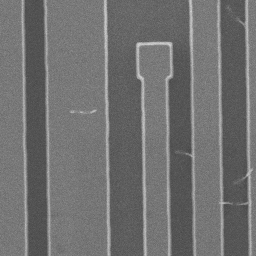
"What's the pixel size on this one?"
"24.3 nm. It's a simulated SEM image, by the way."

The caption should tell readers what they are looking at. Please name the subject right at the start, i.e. groups of lines, slits or small figures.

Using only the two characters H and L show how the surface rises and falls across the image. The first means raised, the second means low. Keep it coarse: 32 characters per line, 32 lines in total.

HHHLLLHHHHHHHLLLLLLLLLLLHHHLLLLH
HHHLLLHHHHHHHLLLLLLLLLLLHHHLLLLH
HHHLLLHHHHHHHLLLLLLLLLLLHHHLLLLH
HHHLLLHHHHHHHLLLLLLLLLLLHHHLLLLH
HHHLLLHHHHHHHLLLLLLLLLLLHHHLLLLH
HHHLLLHHHHHHHLLLLLHHHLLLHHHLLLLH
HHHLLLHHHHHHHLLLLHHHHLLLHHHLLLLH
HHHLLLHHHHHHHLLLLHHHHLLLHHHLLLLH
HHHLLLHHHHHHHLLLLHHHHLLLHHHLLLLH
HHHLLLHHHHHHHLLLLHHHHLLLHHHLLLLH
HHHLLLHHHHHHHLLLLLHHHLLLHHHHLLLH
HHHLLLHHHHHHHLLLLLHHHLLLHHHLLLLH
HHHLLLHHHHHHHLLLLLHHHLLLHHHLLLLH
HHHLLLHHHHHHHLLLLLHHHLLLHHHHLLLH
HHHLLLHHHHHHHLLLLLHHHLLLHHHHLLLH
HHHLLLHHHHHHHLLLLLHHHLLLHHHHLLLH
HHHLLLHHHHHHHLLLLLHHHLLLHHHHLLLH
HHHLLLHHHHHHHLLLLLHHHLLLHHHHLLLH
HHHLLLHHHHHHHLLLLLHHHLLLHHHHLLLH
HHHLLLHHHHHHHLLLLLHHHLLLHHHHLLLH
HHHLLLHHHHHHHLLLLLHHHLLLHHHHLLLH
HHHLLLHHHHHHHLLLLLHHHLLLHHHHLLLH
HHHLLLHHHHHHHLLLLLHHHLLLHHHHLLLH
HHHLLLHHHHHHHLLLLLHHHLLLHHHHLLLH
HHHLLLHHHHHHHLLLLLHHHLLLHHHHLLLH
HHHLLLHHHHHHHLLLLLHHHLLLHHHHLLLH
HHHLLLHHHHHHHLLLLLHHHLLLHHHHLLLH
HHHLLLHHHHHHHLLLLLHHHLLLHHHHLLLH
HHHLLLHHHHHHHHLLLLHHHLLLHHHHLLLH
HHHLLLHHHHHHHHLLLLHHHLLLHHHHLLLH
HHHLLLHHHHHHHHLLLLHHHLLLHHHHLLLH
HHHLLLHHHHHHHHLLLLHHHLLLHHHHLLLH